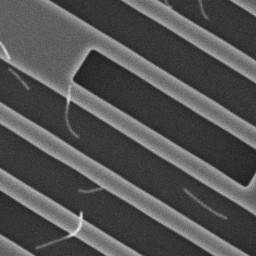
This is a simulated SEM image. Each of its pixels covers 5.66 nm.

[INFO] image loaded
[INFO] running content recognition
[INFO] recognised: groups of lines, slits or small figures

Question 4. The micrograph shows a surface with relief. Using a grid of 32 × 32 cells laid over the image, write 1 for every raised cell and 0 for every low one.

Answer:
11111110000000001111000000000011
11111111100000000011110000000001
11111111110000000001111100000000
11111111111100000000011110000000
11111111111110000000000111100000
11111111111111100000000011111000
11111111111011111000000000111100
11111111111000111100000000011111
00111111110000001111000000000111
00001111100000000111110000000001
00000111110000000001111000000000
00000001111000000000111110000000
00000000011110000000001111000000
10000000001111000000000011110000
11100000000011110000000001111100
11110000000000111100000000011110
00111100000000011110000000000111
00011111000000000111100000000011
00000111100000000011111000000000
00000001111000000000111100000000
00000000111100000000001111000000
10000000001111000000000111110000
11000000000111110000000001111001
11110000000001111000000000111111
01111100000000011110000000001111
00011110000000001111100000000011
00001111100000000011110000000001
00000011111000000000111100000000
00000000111100000000011110000000
00000000011111000000000111100000
11000000000111100000000011111000
11110000000001111000000000111100